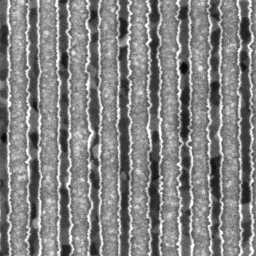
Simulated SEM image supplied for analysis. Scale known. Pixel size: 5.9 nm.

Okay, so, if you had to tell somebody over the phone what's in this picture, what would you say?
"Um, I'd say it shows parallel lines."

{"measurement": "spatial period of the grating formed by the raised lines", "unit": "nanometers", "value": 179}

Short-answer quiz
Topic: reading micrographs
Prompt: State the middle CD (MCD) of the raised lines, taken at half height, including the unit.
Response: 70.8 nm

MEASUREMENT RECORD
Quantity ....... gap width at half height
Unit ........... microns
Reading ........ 0.108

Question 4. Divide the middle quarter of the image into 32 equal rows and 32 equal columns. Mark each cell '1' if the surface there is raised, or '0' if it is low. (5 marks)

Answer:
10000111100000110000011100000111
10000111100000111000011100000111
11000011100000111000011100000111
10000011100000110000011100000111
10000011100000111000011100000111
10000011100000111000011100000111
10000011100001111000011100000111
10000011100001110000011100000111
10000011100001110000011100000111
10000011100001111000011100000111
10000011110001110000001100000111
10000011100000110000011100000111
11000011100000110000011100000111
11000011100001111000011100000111
11000011100001111000011100000111
11000011100001111000011100000111
11000011100001110000011100000111
11000001100000111000011100000110
10000011100001111000011100000111
10000011100000111000001100000110
10000011100000111000001100000110
11000011100000111000001100000111
10000011100000110000011100000111
10000011100000111000011100000111
11000011100000111000011100000111
11000011100000111000011100000111
10000011100000111000011100000111
11000011100000110000001100000111
11000011100000111000001100001111
10000011100000111000011100000111
10000001100000111000011110001111
10000011100000111000011100001111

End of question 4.